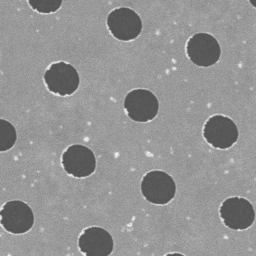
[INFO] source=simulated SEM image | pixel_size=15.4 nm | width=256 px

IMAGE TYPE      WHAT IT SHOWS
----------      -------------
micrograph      a regular array of holes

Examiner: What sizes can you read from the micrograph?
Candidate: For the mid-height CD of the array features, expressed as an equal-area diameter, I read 0.518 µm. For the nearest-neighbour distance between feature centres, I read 1.28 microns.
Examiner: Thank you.